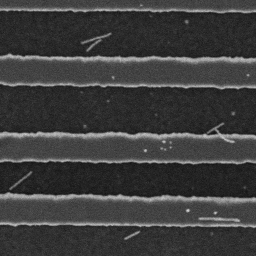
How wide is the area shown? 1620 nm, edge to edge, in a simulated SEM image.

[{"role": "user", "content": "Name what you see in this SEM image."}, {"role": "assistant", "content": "lines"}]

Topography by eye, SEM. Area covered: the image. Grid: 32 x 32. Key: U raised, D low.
UUUUUUUUUUUUUUUUUUUUUUUUUUUUUUUU
DDDDDDDDDDDDDDDDDDDDDDDDDDDUUDUU
DDDDDDDDDDDDDDDDDDDDDDDDDDDDDDDD
DDDDDDDDDDDDDDDDDDDDDDDDDDDDDDDD
DDDDDDDDDDDDDDDDDDDDDDDDDDDDDDDD
DDDDDDDDDDDDDDDDDDDDDDDDDDDDDDDD
DDDDDDDDDDDDDDDDDDDDDDDDDDDDDDDD
UUUUUUUUUUUUUUUUUUUUUUUUUUUUUUUU
UUUUUUUUUUUUUUUUUUUUUUUUUUUUUUUU
UUUUUUUUUUUUUUUUUUUUUUUUUUUUUUUU
UUUUUUUUUUUUUUUUUUUUUUUUUUUUUUUU
DDDDDDDDDDDDDDDDDDDDDDDDDDDDDDDD
DDDDDDDDDDDDDDDDDDDDDDDDDDDDDDDD
DDDDDDDDDDDDDDDDDDDDDDDDDDDDDDDD
DDDDDDDDDDDDDDDDDDDDDDDDDDDDDDDD
DDDDDDDDDDDDDDDDDDDDDDDDDDDDDDDD
DDDDDDDDDDDDDDDDDDDDDDDDDDDDDDDD
UUUUUUUUUUUUUUUUUUUUUUUUUUUUUUUU
UUUUUUUUUUUUUUUUUUUUUUUUUUUUUUUU
UUUUUUUUUUUUUUUUUUUUUUUUUUUUUUUU
DDDDDDDDDDDDDDDDDDDDDDDDDDDDDDDD
DDDDDDDDDDDDDDDDDDDDDDDDDDDDDDDD
DDDDDDDDDDDDDDDDDDDDDDDDDDDDDDDD
DDDDDDDDDDDDDDDDDDDDDDDDDDDDDDDD
UUUUUUUUUUUUUUUUDDDDUDDDDDDDDDDD
UUUUUUUUUUUUUUUUUUUUUUUUUUUUUUUU
UUUUUUUUUUUUUUUUUUUUUUUUUUUUUUUU
UUUUUUUUUUUUUUUUUUUUUUUUUUUUUUUU
DDDDDDDDDDDDDDDDDDDDDDDDDDDDDDDD
DDDDDDDDDDDDDDDDDDDDDDDDDDDDDDDD
DDDDDDDDDDDDDDDDDDDDDDDDDDDDDDDD
DDDDDDDDDDDDDDDDDDDDDDDDDDDDDDDD